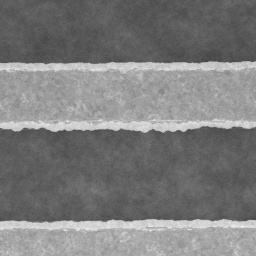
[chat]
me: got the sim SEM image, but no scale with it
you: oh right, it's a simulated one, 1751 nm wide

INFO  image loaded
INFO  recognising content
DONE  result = one or a few lines or trenches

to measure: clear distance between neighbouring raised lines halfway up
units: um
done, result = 0.669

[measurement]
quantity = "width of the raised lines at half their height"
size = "0.412 micrometres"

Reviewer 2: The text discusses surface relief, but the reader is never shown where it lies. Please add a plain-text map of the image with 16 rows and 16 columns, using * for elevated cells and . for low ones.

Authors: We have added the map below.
................
................
................
................
****************
****************
****************
****************
................
................
................
................
................
................
****************
****************